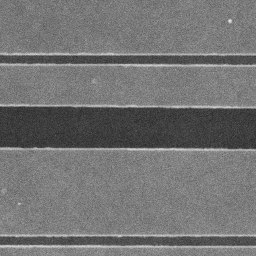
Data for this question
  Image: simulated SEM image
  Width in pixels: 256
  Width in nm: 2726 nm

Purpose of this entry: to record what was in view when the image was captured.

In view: lines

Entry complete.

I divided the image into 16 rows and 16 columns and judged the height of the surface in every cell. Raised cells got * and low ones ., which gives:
****************
****************
****************
****************
****************
****************
****************
................
................
****************
****************
****************
****************
****************
****************
****************